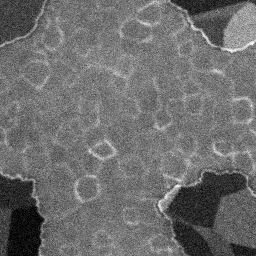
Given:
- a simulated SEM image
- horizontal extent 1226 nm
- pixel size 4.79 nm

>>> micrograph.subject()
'raised bodies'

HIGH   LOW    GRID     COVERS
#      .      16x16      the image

###........#####
##..........####
#............###
................
................
................
................
................
................
................
................
##..........####
##........######
###.......######
###........#####
###........#####